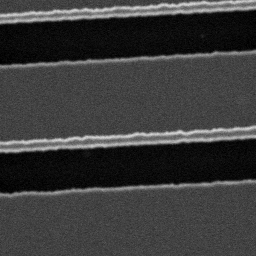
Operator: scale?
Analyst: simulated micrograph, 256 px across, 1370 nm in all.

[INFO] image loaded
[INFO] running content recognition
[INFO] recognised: lines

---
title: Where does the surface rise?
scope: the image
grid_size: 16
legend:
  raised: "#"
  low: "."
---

################
................
................
...........#####
################
################
################
################
################
................
................
............####
################
################
################
################